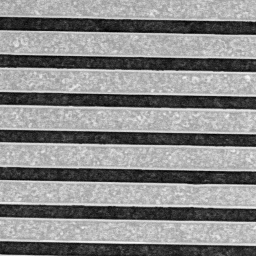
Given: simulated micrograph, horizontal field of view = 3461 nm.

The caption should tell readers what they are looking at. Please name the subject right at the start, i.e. parallel lines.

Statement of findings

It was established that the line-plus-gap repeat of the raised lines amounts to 0.505 um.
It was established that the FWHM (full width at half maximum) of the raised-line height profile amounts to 0.321 um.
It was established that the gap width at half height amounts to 186 nm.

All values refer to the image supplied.